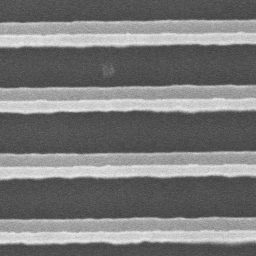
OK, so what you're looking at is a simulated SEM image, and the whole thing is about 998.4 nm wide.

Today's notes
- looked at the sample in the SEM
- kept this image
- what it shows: lines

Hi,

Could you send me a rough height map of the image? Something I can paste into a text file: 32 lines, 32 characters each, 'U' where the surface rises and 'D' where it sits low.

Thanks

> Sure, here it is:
DDDDDDDDDDDDDDDDDDDDDDDDDDDDDDDD
DDDDDDDDDDDDDDDDDDDDDDDDDDDDDDDD
DDDDDDDDDDDDDDDDDDDDDDDDDDDDDDDD
UUUUUUUUUUUUUUUUUUUUUUUUUUUUUUUU
UUUUUUUUUUUUUUUUUUUUUUUUUUUUUUUU
UUUUUUUUUUUUUUUUDDDDDDDDDDDDDDDD
DDDDDDDDDDDDDDDDDDDDDDDDDDDDDDDD
DDDDDDDDDDDDDDDDDDDDDDDDDDDDDDDD
DDDDDDDDDDDDDDDDDDDDDDDDDDDDDDDD
DDDDDDDDDDDDDDDDDDDDDDDDDDDDDDDD
DDDDDDDDDDDDDDDDDDDDDDDDDDDDDDDD
UUUUUUUUUUUUUUUUUUUUUUUUUUUUUUUU
UUUUUUUUUUUUUUUUUUUUUUUUUUUUUUUU
UUUUUUUUUUUUUUUUUUUUUUUUUUUUUUUU
DDDDDDDDDDDDDDDDDDDDDDDDDDDDDDDD
DDDDDDDDDDDDDDDDDDDDDDDDDDDDDDDD
DDDDDDDDDDDDDDDDDDDDDDDDDDDDDDDD
DDDDDDDDDDDDDDDDDDDDDDDDDDDDDDDD
DDDDDDDDDDDDDDDDDDDDDDDDDDDDDDDD
UUUUUUUUUUUUUUUUUUUUUUUUUUUUUUUU
UUUUUUUUUUUUUUUUUUUUUUUUUUUUUUUU
UUUUUUUUUUUUUUUUUUUUUUUUUUUUUUUU
DDDDDDDDDDDDDDDDDDDDDDDDDDDDDDDD
DDDDDDDDDDDDDDDDDDDDDDDDDDDDDDDD
DDDDDDDDDDDDDDDDDDDDDDDDDDDDDDDD
DDDDDDDDDDDDDDDDDDDDDDDDDDDDDDDD
DDDDDDDDDDDDDDDDDDDDDDDDDDDDDDDD
DDDDDDDDDDUUUUUUUUUUUUUUUUUUUUUU
UUUUUUUUUUUUUUUUUUUUUUUUUUUUUUUU
UUUUUUUUUUUUUUUUUUUUUUUUUUUUUUUU
DDDDDDDDDDDDDDDDDDDDDDDDDDDDDDDD
DDDDDDDDDDDDDDDDDDDDDDDDDDDDDDDD